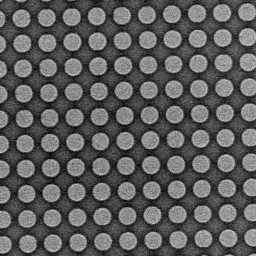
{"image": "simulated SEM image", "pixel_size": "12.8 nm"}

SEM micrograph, an array of small figures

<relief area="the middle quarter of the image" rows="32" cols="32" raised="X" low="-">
XXXX--XXXXX--XXXX--XXXX--XXXX---
XXXX---XXX---XXXX--XXXX---XXX---
-XX-----X-----------------------
--------------------------------
---------------------------X----
-XXX---XXX---XXXX--XXXX---XXX---
XXXX---XXXX--XXXX--XXXX--XXXX---
XXXX---XXXX--XXXX--XXXX---XXX---
-XXX---XXX----XX-----X----------
--------------------------------
--------------------------------
--X-----XX----XXX---XXX---XXX---
-XXX---XXXX--XXXX--XXXX---XXXX--
-XXXX--XXXX--XXXX--XXXX---XXX---
-XXX---XXX----XXX---XXX----X----
--------------------------------
--------------------------------
--------XX----XX----XXX---XXX---
-XXX---XXXX--XXXX---XXXX--XXXX--
-XXXX--XXXX--XXXX---XXXX--XXXX--
-XXXX--XXXX---XXX---XXX----XX---
--XX----------------------------
--------------------------------
---------------X-----XX----XX---
-XXXX---XXX---XXX---XXXX--XXXX--
-XXXX--XXXX--XXXX---XXXX--XXXX--
-XXXX--XXXX---XXX---XXX---XXXX--
--XX----XX----------------------
--------------------------------
---------------------------XX---
--XX----XXX---XXX---XXXX--XXXX--
-XXXX--XXXX---XXXX--XXXX--XXXX--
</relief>